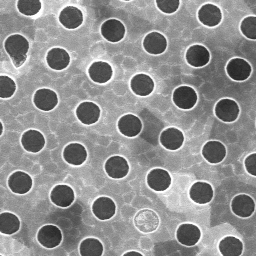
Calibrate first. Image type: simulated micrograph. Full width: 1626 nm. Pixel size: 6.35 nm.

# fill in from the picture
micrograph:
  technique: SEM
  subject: a regular array of holes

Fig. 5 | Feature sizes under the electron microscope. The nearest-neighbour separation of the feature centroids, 272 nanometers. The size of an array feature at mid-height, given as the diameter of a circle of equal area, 24.2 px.